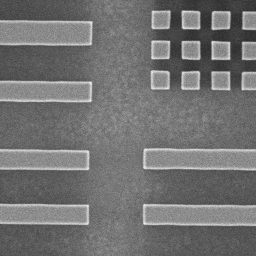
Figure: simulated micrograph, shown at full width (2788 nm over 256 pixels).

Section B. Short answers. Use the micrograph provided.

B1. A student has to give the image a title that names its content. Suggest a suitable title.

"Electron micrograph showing groups of lines, slits or small figures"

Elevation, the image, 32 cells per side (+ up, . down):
................................
...................++..++.......
...................++..++..++.++
+++++++++++........++..++..+..++
+++++++++++.....................
+++++++++++........++..++..++.++
...................++..++..++.++
................................
................................
...................++..++..++.++
+++++++++++........++..++..++.++
+++++++++++.....................
+++++++++++.....................
................................
................................
................................
................................
................................
................................
+++++++++++.......++++++++++++++
+++++++++++.......++++++++++++++
................................
................................
................................
................................
................................
+++++++++++.......++++++++++++++
+++++++++++.......++++++++++++++
................................
................................
................................
................................